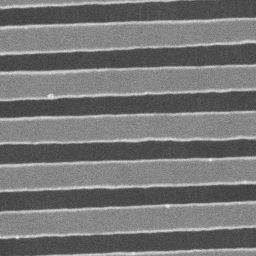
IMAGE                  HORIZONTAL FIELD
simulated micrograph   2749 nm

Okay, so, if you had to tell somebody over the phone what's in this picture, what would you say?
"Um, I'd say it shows lines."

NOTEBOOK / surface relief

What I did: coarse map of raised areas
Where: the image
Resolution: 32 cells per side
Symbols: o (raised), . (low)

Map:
oooooooooooooo..................
................................
..........................oooooo
oooooooooooooooooooooooooooooooo
oooooooooooooooooooooooooooooooo
oooooooooooooooooooooooooooooo..
ooooooo.........................
................................
................oooooooooooooooo
oooooooooooooooooooooooooooooooo
oooooooooooooooooooooooooooooooo
oooooooooooooooooooooooooooo....
oo..............................
................................
..........oooooooooooooooooooooo
oooooooooooooooooooooooooooooooo
oooooooooooooooooooooooooooooooo
ooooooooooooooooooo.oooo........
................................
................................
...ooooooooooooooooooooooooooooo
oooooooooooooooooooooooooooooooo
oooooooooooooooooooooooooooooooo
oooooooooooo.oo.................
................................
.......................ooooooooo
oooooooooooooooooooooooooooooooo
oooooooooooooooooooooooooooooooo
ooooooooooooooooooooooooooooooo.
oooooo.o........................
................................
..................oooooooooooooo